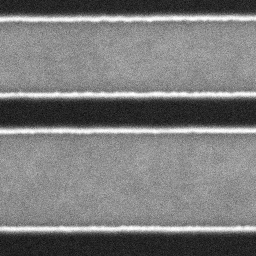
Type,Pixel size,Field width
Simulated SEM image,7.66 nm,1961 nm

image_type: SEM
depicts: lines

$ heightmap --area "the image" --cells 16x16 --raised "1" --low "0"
1111111111111111
0000000000000000
0000000000000000
0000000000000000
0000000000000000
0000000000000000
1111111111111111
1111111111111111
0000000000000000
0000000000000000
0000000000000000
0000000000000000
0000000000000000
0000000000000000
1111111111111111
1111111111111111